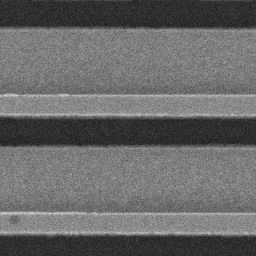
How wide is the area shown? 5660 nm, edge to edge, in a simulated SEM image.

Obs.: lines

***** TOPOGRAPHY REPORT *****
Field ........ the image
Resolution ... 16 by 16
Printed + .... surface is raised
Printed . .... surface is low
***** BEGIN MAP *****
................
................
++++++++++++++++
++++++++++++++++
++++++++++++++++
++++++++++++++++
++++++++++++++++
................
................
++++++++++++++++
++++++++++++++++
++++++++++++++++
++++++++++++++++
++++++++++++++++
++++++++++++++++
................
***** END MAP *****